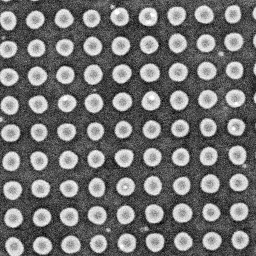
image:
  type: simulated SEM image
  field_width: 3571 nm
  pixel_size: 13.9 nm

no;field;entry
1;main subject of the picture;an array of small figures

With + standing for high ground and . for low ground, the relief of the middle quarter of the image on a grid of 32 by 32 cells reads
......++......++....+++....+++..
++....+++....++++..+++++..+++++.
++...++++...+++++..+++++..+++++.
++...++++...++++....+++....+++..
++....+++....++.................
................................
................................
..............++.....++....+++..
++....+++....++++...++++...++++.
+++..+++++..+++++...++++...++++.
+++..+++++...++++...++++...+++..
++....+++.....+.................
................................
................................
..............+......++.....++..
++....++++...++++...++++...++++.
+++...++++...++++...++++...++++.
+++...++++...+++....++++...++++.
++.....++.......................
................................
................................
.....................++.....++..
+++...++++...++++...++++...++++.
+++...++++...++++...++++...++++.
+++...++++...++++...++++...++++.
+++....++.....++................
................................
................................
.....................++......++.
+++....+++....+++...++++....+++.
+++...++++...+++++..++++...++++.
+++...++++...++++...++++....+++.